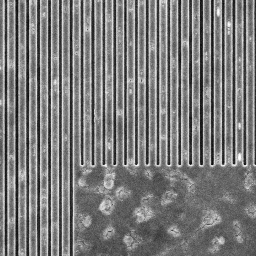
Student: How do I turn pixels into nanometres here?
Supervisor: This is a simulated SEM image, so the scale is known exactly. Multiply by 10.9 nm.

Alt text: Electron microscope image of parallel lines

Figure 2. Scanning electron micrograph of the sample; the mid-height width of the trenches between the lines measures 3.87 px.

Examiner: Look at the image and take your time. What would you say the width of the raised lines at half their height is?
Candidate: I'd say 74.7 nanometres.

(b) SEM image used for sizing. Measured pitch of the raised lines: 118 nanometres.